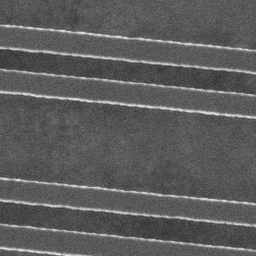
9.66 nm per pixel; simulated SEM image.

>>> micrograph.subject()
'lines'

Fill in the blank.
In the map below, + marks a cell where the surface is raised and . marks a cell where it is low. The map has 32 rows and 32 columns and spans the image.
................................
................................
................................
++++............................
++++++++++++++..................
++++++++++++++++++++++++........
......++++++++++++++++++++++++++
...............+++++++++++++++++
.........................+++++++
+++++++++.......................
+++++++++++++++++++.............
++++++++++++++++++++++++++++....
..........++++++++++++++++++++++
....................++++++++++++
.............................+++
................................
................................
................................
................................
................................
................................
................................
+++.............................
+++++++++++++...................
++++++++++++++++++++++..........
...+++++++++++++++++++++++++++++
..............++++++++++++++++++
........................++++++++
+++++...........................
+++++++++++++++.................
+++++++++++++++++++++++++.......
....++++++++++++++++++++++++++++